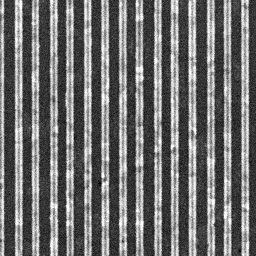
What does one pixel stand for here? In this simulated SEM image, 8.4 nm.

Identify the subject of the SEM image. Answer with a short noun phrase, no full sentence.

parallel lines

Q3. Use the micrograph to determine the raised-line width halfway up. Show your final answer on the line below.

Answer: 0.0431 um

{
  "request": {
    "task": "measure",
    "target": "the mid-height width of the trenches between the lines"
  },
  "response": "99.8 nm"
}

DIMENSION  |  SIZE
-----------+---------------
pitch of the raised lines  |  146 nanometers